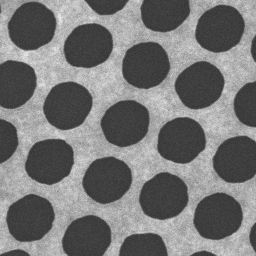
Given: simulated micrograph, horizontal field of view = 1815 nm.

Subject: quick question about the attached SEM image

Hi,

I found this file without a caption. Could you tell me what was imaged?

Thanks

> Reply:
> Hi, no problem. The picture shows a regular array of holes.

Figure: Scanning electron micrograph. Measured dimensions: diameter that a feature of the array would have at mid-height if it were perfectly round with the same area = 0.34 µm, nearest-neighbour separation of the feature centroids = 0.414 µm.